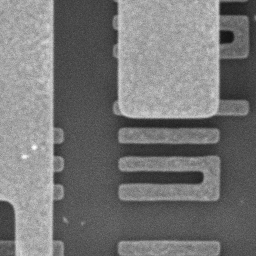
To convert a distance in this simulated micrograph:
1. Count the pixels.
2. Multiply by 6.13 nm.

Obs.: wiring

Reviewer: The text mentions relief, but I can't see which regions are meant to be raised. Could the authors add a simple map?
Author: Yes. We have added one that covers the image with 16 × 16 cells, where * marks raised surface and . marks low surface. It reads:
***....*******..
***....*******..
***....*******..
***....*******..
***....*******..
***....*******..
***....*******..
***.............
***.............
***.............
***.............
***.............
***.............
.**.............
.**.............
.**.............